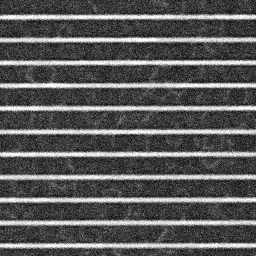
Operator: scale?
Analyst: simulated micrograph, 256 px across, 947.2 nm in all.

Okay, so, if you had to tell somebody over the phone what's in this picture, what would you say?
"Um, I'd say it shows parallel lines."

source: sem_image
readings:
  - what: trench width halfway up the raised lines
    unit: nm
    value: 70.4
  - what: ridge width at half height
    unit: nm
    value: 13.9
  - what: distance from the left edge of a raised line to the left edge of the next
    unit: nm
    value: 84.7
